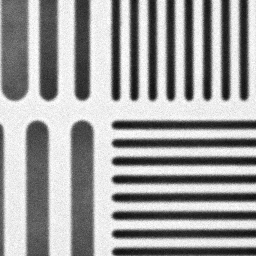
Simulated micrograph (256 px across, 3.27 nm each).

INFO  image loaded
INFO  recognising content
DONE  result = groups of lines, slits or small figures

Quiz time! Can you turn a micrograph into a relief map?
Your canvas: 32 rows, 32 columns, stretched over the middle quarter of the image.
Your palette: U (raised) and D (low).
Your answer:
UUDDDDDUUUUUDDUUDDDUUDDDUDDDUUDD
UUDDDDDUUUUUDDUUDDDUUDDDUDDDUUDD
UUDDDDDUUUUUDDUUDDDUUDDDUDDDUUDD
UUDDDDDUUUUUDDUUDDDUUDDDUDDDUUDD
UUDDDDDUUUUUDDUUDDDUUDDDUDDDUUDD
UUDDDDDUUUUUDDUUDDDUUDDDUDDDUUDD
UUDDDDDUUUUUDDUUDDDUUDDDUDDDUUDD
UUUDDDDUUUUUDDUUDDDUUDDDUUDDUUDD
UUUDDDUUUUUUDDUUUDDUUDDUUUDDUUDD
UUUUUUUUUUUUUUUUUDUUUUUUUUUUUUUU
UUUUUUUUUUUUUUUUUUUUUUUUUUUUUUUU
UUUUUUUUUUUUUUUUUUUUUUUUUUUUUUUU
UUUUUUUUUUUUUUUUUUUUUUUUUUUUUUUU
UUUUUUUUUUUUUUUUUUUUUUUUUUUUUUUU
UUUDDDUUUUUUDDDDDDDDDDDDDDDDDDDD
UUDDDDDUUUUUDDDDDDDDDDDDDDDDDDDD
UUDDDDDDUUUUUDDDDDDDDDDDDDDDDDDD
UDDDDDDDUUUUUUUUUUUUUUUUUUUUUUUU
UDDDDDDDUUUUUUUUUUUUUUUUUUUUUUUU
UDDDDDDDUUUUDDDDDDDDDDDDDDDDDDDD
UDDDDDDDUUUUDDDDDDDDDDDDDDDDDDDD
UDDDDDDDUUUUUUUUUUUUUUUUUUUUUUUU
UDDDDDDDUUUUUUUUUUUUUUUUUUUUUUUU
UDDDDDDDUUUUDDDDDDDDDDDDDDDDDDDD
UDDDDDDDUUUUDDDDDDDDDDDDDDDDDDDD
UDDDDDDDUUUUUDDDDDDDDDDDDDDDDDDD
UDDDDDDDUUUUUUUUUUUUUUUUUUUUUUUU
UDDDDDDDUUUUUUUUUUUUUUUUUUUUUUUU
UDDDDDDDUUUUDDDDDDDDDDDDDDDDDDDD
UDDDDDDDUUUUDDDDDDDDDDDDDDDDDDDD
UDDDDDDDUUUUUUUUUUUUUUUUUUUUUUUU
UDDDDDDDUUUUUUUUUUUUUUUUUUUUUUUU